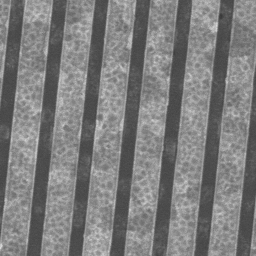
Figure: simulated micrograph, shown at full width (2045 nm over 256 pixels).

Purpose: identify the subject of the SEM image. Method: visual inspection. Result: parallel lines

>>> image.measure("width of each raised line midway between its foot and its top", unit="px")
26.9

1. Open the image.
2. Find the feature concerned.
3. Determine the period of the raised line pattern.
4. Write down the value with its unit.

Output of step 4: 332 nm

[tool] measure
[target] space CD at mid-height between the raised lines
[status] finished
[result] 0.117 micrometres